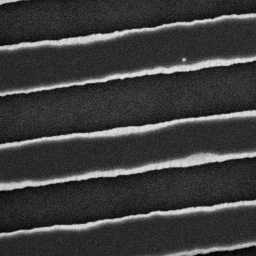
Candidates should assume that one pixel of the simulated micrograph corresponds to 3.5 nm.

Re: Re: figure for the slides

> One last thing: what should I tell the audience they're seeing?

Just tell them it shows lines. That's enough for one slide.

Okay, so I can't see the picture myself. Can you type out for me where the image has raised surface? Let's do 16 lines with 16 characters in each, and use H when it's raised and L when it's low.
LLLLLLLLLLLLLLLL
LLLLLLLLLLLHHHHH
LLLLLHHHHHHHHHHH
HHHHHHHHHHHHHHHH
HHHHHHHHHHLLLLLL
HHHLLLLLLLLLLLLL
LLLLLLLLLLLLLLLL
LLLLLLLLLLLHHHHH
LLLLHHHHHHHHHHHH
HHHHHHHHHHHHHHHH
HHHHHHHHHHLLLLLL
HHHLLLLLLLLLLLLL
LLLLLLLLLLLLLLLL
LLLLLLLLHHHHHHHH
LHHHHHHHHHHHHHHH
HHHHHHHHHHHHHHHL